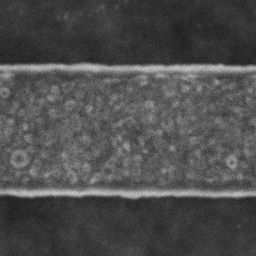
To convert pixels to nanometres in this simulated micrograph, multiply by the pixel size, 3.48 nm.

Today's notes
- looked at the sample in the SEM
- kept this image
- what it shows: one or a few lines or trenches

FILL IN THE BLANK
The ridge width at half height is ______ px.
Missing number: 126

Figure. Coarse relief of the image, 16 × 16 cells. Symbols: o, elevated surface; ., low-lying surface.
................
................
................
................
oooooooooooooooo
oooooooooooooooo
oooooooooooooooo
oooooooooooooooo
oooooooooooooooo
oooooooooooooooo
oooooooooooooooo
oooooooooooooooo
................
................
................
................